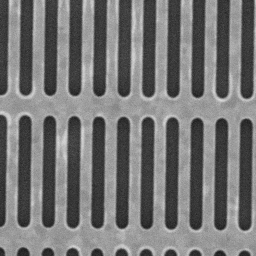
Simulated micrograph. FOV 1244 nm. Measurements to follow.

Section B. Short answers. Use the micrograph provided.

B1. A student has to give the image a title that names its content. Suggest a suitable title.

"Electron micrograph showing groups of lines, slits or small figures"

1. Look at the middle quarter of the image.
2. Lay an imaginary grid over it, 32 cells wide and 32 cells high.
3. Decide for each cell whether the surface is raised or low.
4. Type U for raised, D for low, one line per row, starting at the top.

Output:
UDDDDUUDDDDUUDDDDUUDDDDUUUDDDUUU
UDDDDUUDDDDUUDDDDUUDDDDUUUDDDUUU
UDDDDUUDDDDUUDDDDUUDDDDUUUDDDUUD
UDDDDUUDDDDUUDDDDUUDDDDUUUDDDUUU
UDDDDUUDDDDUUDDDDUUDDDDUUUDDDUUU
UDDDDUUDDDDUUDDDDUUDDDDUUUDDDUUU
UDDDDUUDDDDUUDDDDUUDDDDUUUDDDUUU
UDDDUUUDDDUUUUDDDUUDDDDUUUDDDUUU
UUUUUUUUUUUUUUUUUUUUDDUUUUDDUUUU
UUUUUUUUUUUUUUUUUUUUUUUUUUUUUUUU
UUUUUUUUUUUUUUUUUUUUUUUUUUUUUUUU
UUUUUUUUUUUUUUUUUUUUUUUUUUUUUUUU
UUUUUUUUUUUUUUUUUUUUUUUUUUUUUUUU
UDDDUUUDDDUUUUDDUUUUDDUUUUDDUUUU
UDDDUUUDDDUUUDDDDUUDDDDUUDDDDUUU
UDDDDUUDDDUUUDDDDUUDDDDUUDDDDUUD
UDDDDUUDDDUUUDDDDUUDDDDUUDDDDUUD
UDDDDUUDDDUUUDDDDUUDDDDUUDDDDUUD
DDDDDUUDDDUUUDDDDUUDDDDUUDDDDUUD
DDDDDUUDDDUUUDDDDUUDDDDUUDDDDUUD
DDDDDUUDDDUUUDDDDUUDDDDUUDDDDUUD
DDDDDUUDDDUUUDDDDUUDDDDUUDDDDUUD
DDDDDUUDDDUUUDDDDUUDDDDUUDDDDUUD
UDDDUUUDDDUUUDDDDUUDDDDUUDDDDUUD
UDDDUUUDDDUUUDDDDUUDDDDUUDDDDUUD
UDDDUUUDDDUUUDDDDUUDDDDUUDDDDUUD
UDDDUUUDDDUUUDDDDUUDDDDUUDDDDUUD
UDDDUUUDDDUUUDDDDUUDDDDUUDDDDUUD
UDDDUUUDDDUUUDDDDUUDDDDUUDDDDUUD
UDDDUUUDDDUUUDDDDUUDDDDUUDDDDUUD
UDDDUUUDDDUUUDDDUUUDDDDUUDDDDUUD
UDDDUUUDDDUUUDDDUUUDDDDUUDDDDUUD